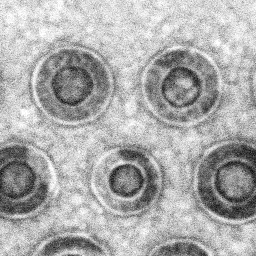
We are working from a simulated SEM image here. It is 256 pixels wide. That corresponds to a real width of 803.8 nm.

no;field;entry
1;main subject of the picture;ring-shaped raised bodies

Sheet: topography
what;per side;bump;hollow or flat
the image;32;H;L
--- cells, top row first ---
LLLLLLLLLLLLLLLLLLLLLLLLLLLLLLLL
LLLLLLLLLLLLLLLLLLLLLLLLLLLLLLLL
LLLLLLLLLLLLLLLLLLLLLLLLLLLLLLLL
LLLLLLLLLLLLLLLLLLLLLLLLLLLLLLLL
LLLLLLLLLLLLLLLLLLLLLLLLLLLLLLLL
LLLLLLLLLLLLLLLLLLLLLLLLLLLLLLLL
LLLLLLLHHHHLLLLLLLLLHHHHHLLLLLLL
LLLLLHHHHHHHHLLLLLLHHHHHHHLLLLLL
LLLLLHHHLLHHHLLLLLHHHHLLHHHLLLLL
LLLLHHHLLLLHHHLLLLHHHLLLLHHLLLLL
LLLLHHLLLLLLHHLLLLHHLLLLLHHHLLLL
LLLLHHHLLLLHHHLLLLHHLLLLLHHHLLLL
LLLLLHHLLLLHHHLLLLHHHLLLLHHLLLLL
LLLLLHHHHHHHHLLLLLLHHHHHHHHLLLLL
LLLLLLHHHHHHLLLLLLLLHHHHHHLLLLLL
LLLLLLLLLLLLLLLLLLLLLLHHLLLLLLLL
LLLLLLLLLLLLLLLLLLLLLLLLLLLLLLLL
LLLLLLLLLLLLLLLLLLLLLLLLLLLLLLLL
HHHHLLLLLLLLLLLHHLLLLLLLLLLHHHHH
HHHHHHLLLLLLLHHHHHHLLLLLLHHHHHHH
HLLLHHLLLLLLHHHLLHHLLLLLLHHHLLLH
LLLLHHHLLLLLHHLLLLHHLLLLHHHLLLLL
LLLLLHHLLLLHHLLLLLHHLLLLHHHLLLLL
LLLLHHHLLLLLHHLLLLHHLLLLHHHLLLLL
HLLLHHLLLLLLHHHLLHHHLLLLLHHLLLLH
HHHHHHLLLLLLLHHHHHHLLLLLLHHHHHHH
HHHHLLLLLLLLLLHHHLLLLLLLLLHHHHHH
LLLLLLLLLLLLLLLLLLLLLLLLLLLLHHHL
LLLLLLLLLLLLLLLLLLLLLLLLLLLLLLLL
LLLLLLLHHHHLLLLLLLLLLLLLLLLLLLLL
LLLLLHHHHHHHLLLLLLLLHHHHHLLLLLLL
LLLLHHHHHHHHHLLLLLLHHHHHHHLLLLLL